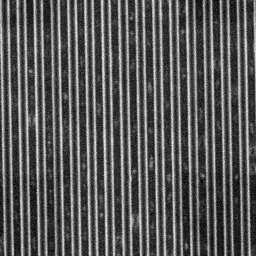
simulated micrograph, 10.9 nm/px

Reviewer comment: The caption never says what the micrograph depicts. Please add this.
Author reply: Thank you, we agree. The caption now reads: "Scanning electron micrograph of parallel lines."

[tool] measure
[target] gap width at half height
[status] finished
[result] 91.7 nm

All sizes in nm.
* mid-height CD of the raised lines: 90.3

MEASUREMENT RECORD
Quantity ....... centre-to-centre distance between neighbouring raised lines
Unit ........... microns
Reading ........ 0.185